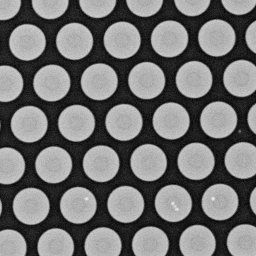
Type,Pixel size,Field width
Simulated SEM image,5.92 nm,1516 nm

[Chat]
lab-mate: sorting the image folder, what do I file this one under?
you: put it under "an array of small figures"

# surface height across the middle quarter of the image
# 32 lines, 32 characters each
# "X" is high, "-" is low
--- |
-------XXXX-------XXXXX-------XX
-----XXXXXXX-----XXXXXXX-----XXX
X----XXXXXXXX---XXXXXXXXX---XXXX
X---XXXXXXXXX---XXXXXXXXX---XXXX
X---XXXXXXXXX---XXXXXXXXX---XXXX
X---XXXXXXXXX---XXXXXXXXX---XXXX
X----XXXXXXXX----XXXXXXXX----XXX
X----XXXXXXX------XXXXXX------XX
-------XXXX--------XXX----------
--------------------------------
--XX---------XXXX-------XXXXX---
XXXXXX------XXXXXX-----XXXXXXX--
XXXXXXX----XXXXXXXX----XXXXXXXX-
XXXXXXX----XXXXXXXX---XXXXXXXXX-
XXXXXXXX---XXXXXXXX---XXXXXXXXX-
XXXXXXXX---XXXXXXXX---XXXXXXXXX-
XXXXXXX----XXXXXXXX----XXXXXXXX-
XXXXXXX----XXXXXXXX-----XXXXXX--
XXXXXX-------XXXX--------XXXX---
--------------------------------
-------------------XXXX--------X
------XXXXXX------XXXXXX-----XXX
X-----XXXXXXX----XXXXXXXX----XXX
XX---XXXXXXXXX---XXXXXXXXX---XXX
XX---XXXXXXXXX---XXXXXXXXX---XXX
XX---XXXXXXXXX---XXXXXXXXX---XXX
XX---XXXXXXXXX---XXXXXXXX----XXX
X-----XXXXXXX-----XXXXXXX-----XX
X------XXXXX-------XXXXX-------X
--------------------------------
--------------------------XXX---
-XXXXX-------XXXXX------XXXXXX--